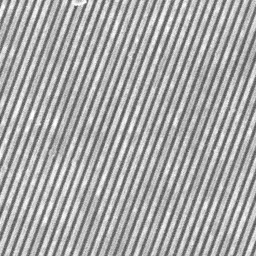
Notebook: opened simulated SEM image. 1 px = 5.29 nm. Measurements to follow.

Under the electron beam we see parallel lines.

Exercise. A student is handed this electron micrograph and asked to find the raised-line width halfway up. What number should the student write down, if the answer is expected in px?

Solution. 3.76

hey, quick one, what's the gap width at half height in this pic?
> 0.0255 micrometres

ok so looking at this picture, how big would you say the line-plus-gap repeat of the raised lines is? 42.8 nanometres